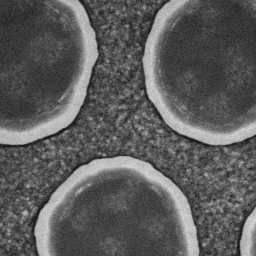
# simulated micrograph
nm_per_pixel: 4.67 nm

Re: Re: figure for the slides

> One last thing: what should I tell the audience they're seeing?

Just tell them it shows raised bodies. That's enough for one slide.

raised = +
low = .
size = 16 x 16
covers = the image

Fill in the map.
+++++......+++++
+++++.....++++++
++++++...+++++++
++++++...+++++++
+++++....+++++++
+++++....+++++++
+++++.....++++++
++++.......+++++
++...........++.
................
......+++.......
....+++++++.....
...++++++++.....
...+++++++++....
...+++++++++...+
...+++++++++...+